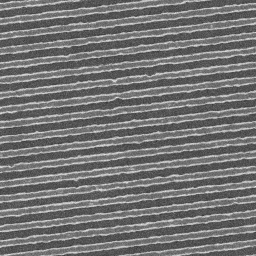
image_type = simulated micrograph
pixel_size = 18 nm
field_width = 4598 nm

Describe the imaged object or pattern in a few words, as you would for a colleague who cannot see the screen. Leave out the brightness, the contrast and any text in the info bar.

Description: parallel lines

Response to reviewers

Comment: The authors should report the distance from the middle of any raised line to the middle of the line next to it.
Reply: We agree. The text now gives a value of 264 nanometres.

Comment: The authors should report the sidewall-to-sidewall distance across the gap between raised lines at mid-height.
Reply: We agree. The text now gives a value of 0.147 micrometres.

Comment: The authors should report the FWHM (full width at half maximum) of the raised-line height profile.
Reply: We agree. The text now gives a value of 6.33 px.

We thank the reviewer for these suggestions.